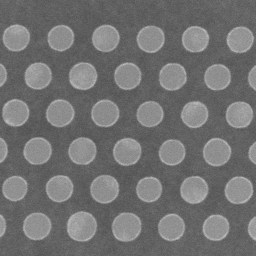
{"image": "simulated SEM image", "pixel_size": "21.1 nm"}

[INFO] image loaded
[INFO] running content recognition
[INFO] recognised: a regular array of raised bodies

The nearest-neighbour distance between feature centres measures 0.921 µm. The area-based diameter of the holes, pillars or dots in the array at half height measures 26 pixels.